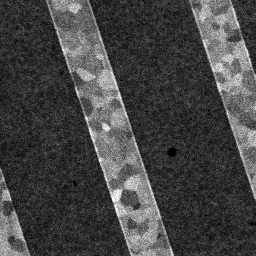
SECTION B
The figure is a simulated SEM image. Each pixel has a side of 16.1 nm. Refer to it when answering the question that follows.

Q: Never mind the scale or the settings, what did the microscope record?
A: one or a few lines or trenches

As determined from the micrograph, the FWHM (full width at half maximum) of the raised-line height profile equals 627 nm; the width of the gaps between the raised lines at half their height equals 1.56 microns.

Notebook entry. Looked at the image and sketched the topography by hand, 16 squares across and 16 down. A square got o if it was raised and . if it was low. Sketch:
...ooo......ooo.
...ooo......ooo.
....oo.......oo.
....ooo......ooo
....ooo......ooo
.....oo.......oo
.....ooo......oo
.....ooo......oo
......oo.......o
......ooo......o
......ooo......o
.......oo.......
o......ooo......
o......ooo......
o.......oo......
oo......ooo.....